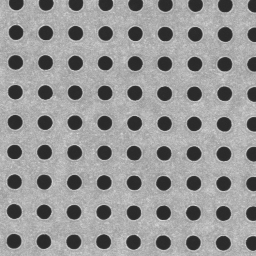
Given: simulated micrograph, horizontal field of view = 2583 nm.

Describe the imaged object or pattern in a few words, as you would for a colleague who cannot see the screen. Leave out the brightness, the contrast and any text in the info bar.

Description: a regular array of holes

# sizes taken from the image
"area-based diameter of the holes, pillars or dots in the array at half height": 148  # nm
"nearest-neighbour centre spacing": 29.4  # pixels